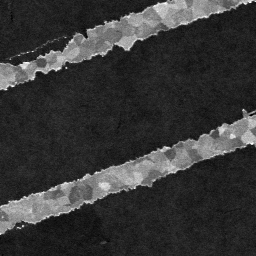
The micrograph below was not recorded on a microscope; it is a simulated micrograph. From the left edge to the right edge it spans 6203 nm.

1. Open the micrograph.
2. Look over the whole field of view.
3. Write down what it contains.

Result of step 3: one or a few lines or trenches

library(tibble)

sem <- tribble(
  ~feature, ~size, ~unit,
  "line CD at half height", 590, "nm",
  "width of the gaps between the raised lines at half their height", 2670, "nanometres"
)